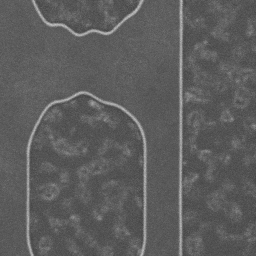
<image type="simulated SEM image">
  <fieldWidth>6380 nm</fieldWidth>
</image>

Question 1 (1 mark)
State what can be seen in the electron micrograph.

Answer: one or a few lines or trenches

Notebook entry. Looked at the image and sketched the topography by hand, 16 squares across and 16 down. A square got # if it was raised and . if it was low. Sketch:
##.......##.....
###....####.....
###########.....
###########.....
###########.....
###########.....
###....####.....
##......###.....
##.......##.....
##.......##.....
##.......##.....
##.......##.....
##.......##.....
##.......##.....
##.......##.....
##.......##.....